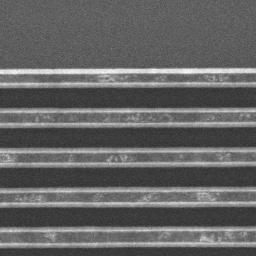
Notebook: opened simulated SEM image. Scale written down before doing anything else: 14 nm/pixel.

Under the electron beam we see parallel lines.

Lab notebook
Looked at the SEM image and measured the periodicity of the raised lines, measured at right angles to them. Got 557 nm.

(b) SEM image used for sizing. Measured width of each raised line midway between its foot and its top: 226 nm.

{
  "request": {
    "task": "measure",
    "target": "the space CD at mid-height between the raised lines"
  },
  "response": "0.34 µm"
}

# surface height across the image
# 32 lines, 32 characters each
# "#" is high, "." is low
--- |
................................
................................
................................
................................
................................
................................
................................
................................
................................
################################
################################
................................
................................
................................
################################
################################
................................
................................
................................
################################
################################
................................
................................
................................
################################
################################
................................
................................
................................
################################
################################
................................